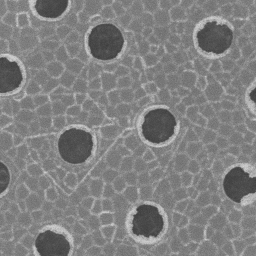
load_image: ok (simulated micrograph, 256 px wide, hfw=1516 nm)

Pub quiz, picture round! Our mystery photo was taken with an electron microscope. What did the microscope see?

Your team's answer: holes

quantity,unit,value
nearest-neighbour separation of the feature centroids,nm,571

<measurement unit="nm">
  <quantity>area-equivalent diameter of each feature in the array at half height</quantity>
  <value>206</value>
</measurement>